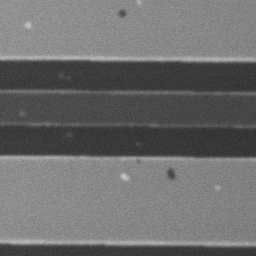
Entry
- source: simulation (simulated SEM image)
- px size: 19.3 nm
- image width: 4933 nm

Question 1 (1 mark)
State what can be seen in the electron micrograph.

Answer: lines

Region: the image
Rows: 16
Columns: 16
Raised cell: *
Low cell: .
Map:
****************
****************
****************
****************
................
................
****************
****************
................
................
****************
****************
****************
****************
****************
................